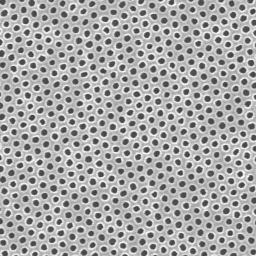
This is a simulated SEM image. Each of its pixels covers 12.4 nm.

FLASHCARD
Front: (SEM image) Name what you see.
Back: a regular array of holes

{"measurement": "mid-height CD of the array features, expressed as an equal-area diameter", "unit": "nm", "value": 80.1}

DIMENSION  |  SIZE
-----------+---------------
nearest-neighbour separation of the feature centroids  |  0.134 microns